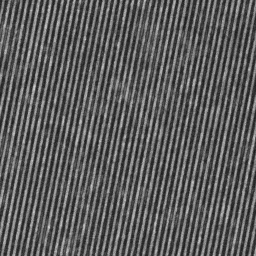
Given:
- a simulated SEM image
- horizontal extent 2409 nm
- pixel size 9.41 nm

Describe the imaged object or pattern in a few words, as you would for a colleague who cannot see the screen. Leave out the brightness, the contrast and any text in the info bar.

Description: parallel lines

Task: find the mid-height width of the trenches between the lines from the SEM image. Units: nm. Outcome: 34.7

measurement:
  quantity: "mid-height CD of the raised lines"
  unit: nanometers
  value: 17.3